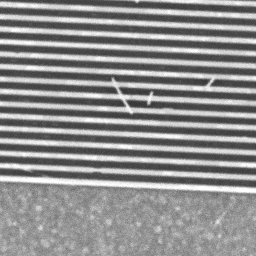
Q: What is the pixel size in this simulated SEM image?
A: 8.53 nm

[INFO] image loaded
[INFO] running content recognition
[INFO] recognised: parallel lines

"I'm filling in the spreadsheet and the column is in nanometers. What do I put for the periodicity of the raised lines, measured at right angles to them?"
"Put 106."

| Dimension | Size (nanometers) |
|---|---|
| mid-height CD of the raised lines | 41.5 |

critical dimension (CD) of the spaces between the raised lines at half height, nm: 66